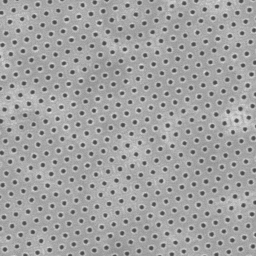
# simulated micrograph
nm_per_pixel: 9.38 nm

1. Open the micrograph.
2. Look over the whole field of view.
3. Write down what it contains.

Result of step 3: a regular array of holes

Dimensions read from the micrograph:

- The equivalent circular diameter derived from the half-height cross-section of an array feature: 42.3 nm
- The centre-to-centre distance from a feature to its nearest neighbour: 113 nanometers